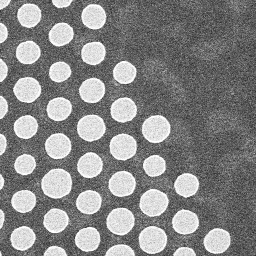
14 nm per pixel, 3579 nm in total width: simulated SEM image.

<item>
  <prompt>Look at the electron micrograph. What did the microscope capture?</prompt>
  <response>a regular array of raised bodies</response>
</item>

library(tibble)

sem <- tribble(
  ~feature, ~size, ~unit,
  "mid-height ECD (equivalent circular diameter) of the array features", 339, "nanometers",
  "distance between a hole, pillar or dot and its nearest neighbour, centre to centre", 516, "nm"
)